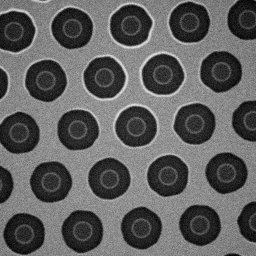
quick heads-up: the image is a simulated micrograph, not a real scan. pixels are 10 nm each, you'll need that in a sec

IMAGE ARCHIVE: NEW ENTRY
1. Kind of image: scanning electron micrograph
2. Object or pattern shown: an array of small figures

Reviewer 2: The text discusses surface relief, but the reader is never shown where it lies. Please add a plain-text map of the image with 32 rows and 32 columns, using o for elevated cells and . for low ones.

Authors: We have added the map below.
oooooooooooooooo.ooooo...oooo...
o..oooo....ooo....ooo.....oo....
....ooo....ooo.....oo.....oo....
....oo......oo.....oo.....ooo...
....ooo.....oo.....ooo....ooo...
....ooo....oooo...oooooooooooooo
o.ooooooooooooooooooooooooo..ooo
ooooo..ooooo...ooo....ooo.....oo
oooo....ooo....ooo.....oo.....oo
.oo.....oo......oo.....oo.....oo
.oo.....ooo.....oo.....oo.....oo
.oo.....ooo....oooo...ooooo.oooo
ooooo..oooooooooooooooooooooooo.
oooooooooooooooo..ooooo...oooo..
o...oooo....ooo....ooo.....oo...
.....oo.....oo......oo.....oo...
.....oo.....oo......oo.....oo...
.....oo.....ooo....oooo...ooooo.
o...oooo...ooooooooooooooooooooo
oooooooooooooooooooo..ooooo...oo
ooooo...oooo...oooo....ooo.....o
.ooo.....oo.....oo......oo.....o
..oo.....oo.....oo......oo.....o
..oo.....oo.....ooo....oooo...oo
.ooo....oooo...ooooo..oooooooooo
ooooooooooooooooooooooooooooooo.
ooooooooo...oooo...oooo....ooo..
o....ooo.....oo.....oo......oo..
o.....oo.....oo.....oo......oo..
......oo.....oo.....ooo....ooo..
o....ooo....oooo...ooooo..oooooo
oo..ooooo..ooooooooooooooooooooo